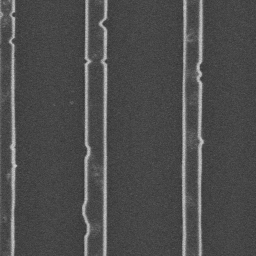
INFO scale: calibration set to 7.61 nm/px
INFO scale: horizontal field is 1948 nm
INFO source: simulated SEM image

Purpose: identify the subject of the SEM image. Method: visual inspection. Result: one or a few lines or trenches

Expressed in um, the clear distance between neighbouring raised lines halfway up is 0.577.